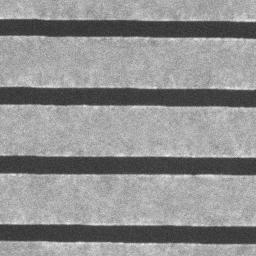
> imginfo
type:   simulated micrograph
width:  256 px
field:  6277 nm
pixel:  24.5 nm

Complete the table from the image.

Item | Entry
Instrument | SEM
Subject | lines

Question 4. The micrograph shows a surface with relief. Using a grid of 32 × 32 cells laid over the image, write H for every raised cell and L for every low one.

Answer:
HHHHHHHHHHHHHHHHHHHHHHHHHHHHHHHH
HHHHHHHHHHHHHHHHHHHHHHHHHHHHHHHH
LLLLLLLLLLLLLLLLHHHHHHHHHHHHHHHH
LLLLLLLLLLLLLLLLLLLLLLLLLLLLLLLL
LLLLLLLLLLLLLLLLLLLLLLLLLLLLLLLL
HHHHHHHHHHHHHHHHHHHHHHHHHHHHHHHH
HHHHHHHHHHHHHHHHHHHHHHHHHHHHHHHH
HHHHHHHHHHHHHHHHHHHHHHHHHHHHHHHH
HHHHHHHHHHHHHHHHHHHHHHHHHHHHHHHH
HHHHHHHHHHHHHHHHHHHHHHHHHHHHHHHH
HHHHHHHHHHHHHHHHHHHHHHHHHHHHHHHH
LLLLLLLLLLLLLLLLLLLLLLLLLLLLLLLL
LLLLLLLLLLLLLLLLLLLLLLLLLLLLLLLL
HHHHHHHHHHHHHHHHHHHHHHHHHHHHHHHL
HHHHHHHHHHHHHHHHHHHHHHHHHHHHHHHH
HHHHHHHHHHHHHHHHHHHHHHHHHHHHHHHH
HHHHHHHHHHHHHHHHHHHHHHHHHHHHHHHH
HHHHHHHHHHHHHHHHHHHHHHHHHHHHHHHH
HHHHHHHHHHHHHHHHHHHHHHHHHHHHHHHH
LLLLLLLLLLLLLLLLLLLLLHHHHHHHHHHH
LLLLLLLLLLLLLLLLLLLLLLLLLLLLLLLL
LLLLLLLLLLLLLLLLLLLLLLLLLLLLLLLL
HHHHHHHHHHHHHHHHHHHHHHHHHHHHHHHH
HHHHHHHHHHHHHHHHHHHHHHHHHHHHHHHH
HHHHHHHHHHHHHHHHHHHHHHHHHHHHHHHH
HHHHHHHHHHHHHHHHHHHHHHHHHHHHHHHH
HHHHHHHHHHHHHHHHHHHHHHHHHHHHHHHH
HHHHHHHHHHHHHHHHHHHHHHHHHHHHHHHH
LLLLLLLLLLLLLLLLLLLLLLLLLLLLLLLL
LLLLLLLLLLLLLLLLLLLLLLLLLLLLLLLL
HHHHHHHHHHHHHHHHHHHHHHHHHHLLLLLL
HHHHHHHHHHHHHHHHHHHHHHHHHHHHHHHH